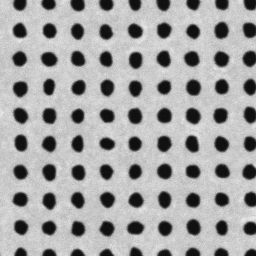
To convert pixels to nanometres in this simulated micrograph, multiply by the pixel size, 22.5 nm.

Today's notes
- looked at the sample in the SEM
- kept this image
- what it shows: a regular array of holes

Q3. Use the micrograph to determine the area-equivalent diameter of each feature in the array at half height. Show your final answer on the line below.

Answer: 344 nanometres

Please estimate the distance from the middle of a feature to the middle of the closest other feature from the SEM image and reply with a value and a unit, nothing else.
623 nanometres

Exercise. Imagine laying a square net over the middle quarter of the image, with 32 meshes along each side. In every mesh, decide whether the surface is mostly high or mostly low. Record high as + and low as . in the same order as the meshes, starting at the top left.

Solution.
+++.++++++..+++++..+++++..+++++.
++++++++++++++++++++++++++++++++
++++++++++++++++++++++++++++++++
++++++++++++++++++++++++++++++++
+++..++++...+++++..+++++..+++++.
++....+++....+++....+++....++++.
++...++++....+++....+++....++++.
+++..++++...+++++..+++++..+++++.
++++++++++++++++++++++++++++++++
++++++++++++++++++++++++++++++++
++++++++++++++++++++++++++++++++
+++..++++...++++...+++++..+++++.
++...++++....+++....+++....+++..
++...++++....+++....+++....+++..
++...+++++..+++++..+++++..+++++.
++++++++++++++++++++++++++++++++
++++++++++++++++++++++++++++++++
++++++++++++++++++++++++++++++++
++...+++++.++++++..+++++..+++++.
++...++++....+++....+++....+++..
++...++++....+++....+++....+++..
++...+++++..+++++..+++++..+++++.
++++++++++++++++++++++++++++++++
++++++++++++++++++++++++++++++++
++++++++++++++++++++++++++++++++
++...++++...+++++..+++++...++++.
++...++++...++++....+++....+++..
++...++++...++++...++++....+++..
++...+++++..+++++..+++++..++++++
++++++++++++++++++++++++++++++++
++++++++++++++++++++++++++++++++
++++++++++++++++++++++++++++++++